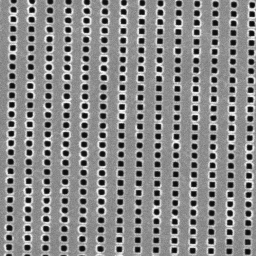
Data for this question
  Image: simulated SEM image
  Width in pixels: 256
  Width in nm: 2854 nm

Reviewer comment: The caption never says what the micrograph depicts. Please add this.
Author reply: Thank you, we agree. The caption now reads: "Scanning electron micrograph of a regular array of holes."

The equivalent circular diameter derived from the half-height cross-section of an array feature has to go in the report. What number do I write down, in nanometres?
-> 74.4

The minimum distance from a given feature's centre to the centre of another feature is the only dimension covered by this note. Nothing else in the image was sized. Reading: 102 nanometres